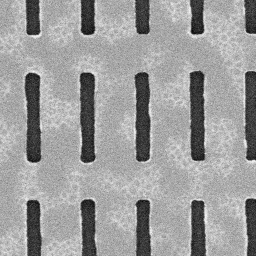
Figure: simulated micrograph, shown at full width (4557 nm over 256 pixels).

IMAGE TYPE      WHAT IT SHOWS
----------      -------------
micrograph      holes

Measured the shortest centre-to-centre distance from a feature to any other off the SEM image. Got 0.972 um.